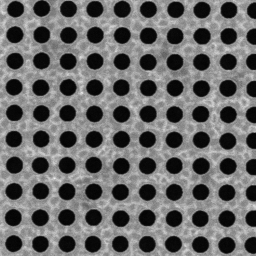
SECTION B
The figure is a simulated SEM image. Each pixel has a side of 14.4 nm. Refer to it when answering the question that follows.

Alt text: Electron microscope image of a regular array of holes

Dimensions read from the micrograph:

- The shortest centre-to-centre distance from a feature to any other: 373 nanometres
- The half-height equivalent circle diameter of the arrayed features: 17.2 px